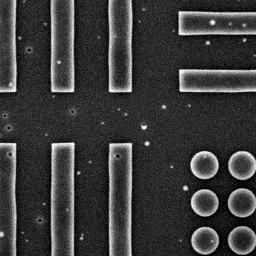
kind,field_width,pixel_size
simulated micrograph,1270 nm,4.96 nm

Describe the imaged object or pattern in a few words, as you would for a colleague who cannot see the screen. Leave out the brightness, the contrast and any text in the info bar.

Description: groups of lines, slits or small figures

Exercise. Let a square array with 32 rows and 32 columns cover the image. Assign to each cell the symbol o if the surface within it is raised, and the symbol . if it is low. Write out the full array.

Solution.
oo....ooo.....oo................
oo....ooo.....oo.......oo.......
oo....ooo.....oo......oooooooooo
oo....ooo.....oo......oooooooooo
oo....ooo.....oo................
oo....ooo.....oo................
oo....ooo.....oo................
oo....ooo.....oo................
oo....ooo.....oo................
oo....ooo.....oo.......ooooooooo
oo....ooo.....oo.......ooooooooo
................................
................................
................................
................................
................................
................................
................................
oo.....oo.....oo................
oo.....oo.....oo........ooo..ooo
oo.....oo.....oo........ooo..ooo
oo.....oo.....oo........ooo..ooo
oo....ooo.....oo................
oo....ooo.....oo................
oo....ooo.....oo........ooo..ooo
oo....ooo.....oo........ooo..ooo
oo....ooo.....oo........ooo..ooo
oo....ooo.....oo................
oo....ooo.....oo.........o...oo.
oo....ooo.....oo........ooo..ooo
oo.....oo.....oo........ooo..ooo
oo....ooo.....oo.........oo..oo.